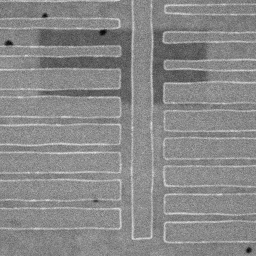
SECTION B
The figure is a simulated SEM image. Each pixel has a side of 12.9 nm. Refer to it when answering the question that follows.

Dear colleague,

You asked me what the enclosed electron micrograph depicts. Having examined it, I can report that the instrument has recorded groups of lines, slits or small figures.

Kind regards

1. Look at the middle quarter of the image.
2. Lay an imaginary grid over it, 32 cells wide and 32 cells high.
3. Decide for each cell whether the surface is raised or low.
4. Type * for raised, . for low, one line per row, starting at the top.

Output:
.................*****...*******
**************...*****..........
**************...*****..........
**************...*****..........
**************...*****..........
**************...*****...*******
.................*****...*******
.................*****...*******
**************...*****...*******
**************...*****...*******
**************...*****..........
**************...*****..........
**************...*****...*******
.................*****...*******
.................*****...*******
**************...*****...*******
**************...*****...*******
**************...*****..........
**************...*****.....*****
**************...*****...*******
.................*****...*******
.................*****...*******
**************...*****...*******
**************...*****...*******
**************...*****..........
**************...*****..........
**************...*****...*******
.................*****...*******
.................*****...*******
**************...*****...*******
**************...*****.....*****
**************...*****..........